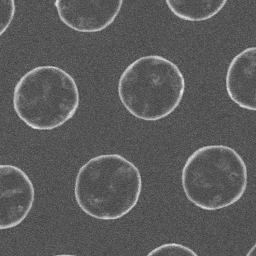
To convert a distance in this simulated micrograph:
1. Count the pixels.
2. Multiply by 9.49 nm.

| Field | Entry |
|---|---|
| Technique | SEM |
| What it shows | raised bodies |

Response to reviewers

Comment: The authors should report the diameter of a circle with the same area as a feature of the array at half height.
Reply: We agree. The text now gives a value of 605 nanometres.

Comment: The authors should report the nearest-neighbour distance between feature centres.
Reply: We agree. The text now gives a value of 1.01 micrometres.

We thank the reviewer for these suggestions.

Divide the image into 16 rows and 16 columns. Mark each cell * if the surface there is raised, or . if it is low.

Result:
*...***....***..
*...***.........
................
...............*
..**....***...**
.****..****...**
.****...***....*
.***............
................
............***.
*....***....***.
**...****..****.
**...****...***.
**....**........
................
..........**....